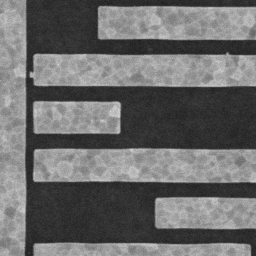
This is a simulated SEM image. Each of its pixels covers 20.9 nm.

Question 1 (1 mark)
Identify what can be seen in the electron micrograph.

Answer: wiring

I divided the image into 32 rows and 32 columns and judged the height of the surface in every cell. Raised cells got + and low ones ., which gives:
+++.............................
+++.........++++++++++++++++++++
+++.........++++++++++++++++++++
+++.........++++++++++++++++++++
+++.........++++++++++++++++++++
+++.............................
+++.............................
+++.++++++++++++++++++++++++++++
+++.++++++++++++++++++++++++++++
+++.++++++++++++++++++++++++++++
+++..+++++++++++++++++++++++++++
+++.............................
+++.............................
+++.+++++++++++.................
+++.+++++++++++.................
+++.+++++++++++.................
+++..++++++++++.................
+++.............................
+++.............................
+++.++++++++++++++++++++++++++++
+++.++++++++++++++++++++++++++++
+++.++++++++++++++++++++++++++++
+++.++++++++++++++++++++++++++++
+++.............................
+++.............................
+++.................++++++++++++
+++.................++++++++++++
+++.................++++++++++++
+++.................++..++++++++
+++.............................
+++....+++......................
+++.+++++++++++++++++++++++++++.